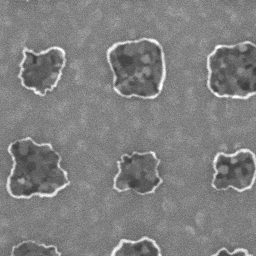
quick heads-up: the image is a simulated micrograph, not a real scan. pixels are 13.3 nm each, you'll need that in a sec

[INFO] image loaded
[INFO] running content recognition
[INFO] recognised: raised bodies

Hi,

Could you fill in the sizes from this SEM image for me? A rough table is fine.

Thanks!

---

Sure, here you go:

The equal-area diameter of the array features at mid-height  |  0.685 micrometres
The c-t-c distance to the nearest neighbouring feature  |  1310 nm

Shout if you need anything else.